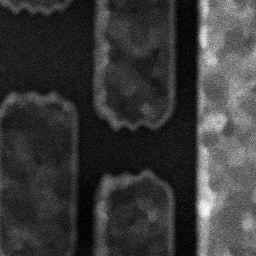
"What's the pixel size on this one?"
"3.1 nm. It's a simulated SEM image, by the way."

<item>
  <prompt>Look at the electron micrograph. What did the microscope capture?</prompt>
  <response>one or a few lines or trenches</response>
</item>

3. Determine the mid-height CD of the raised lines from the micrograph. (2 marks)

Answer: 0.234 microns